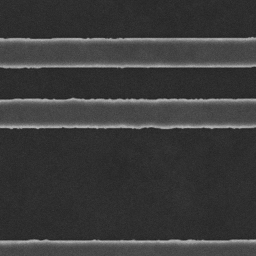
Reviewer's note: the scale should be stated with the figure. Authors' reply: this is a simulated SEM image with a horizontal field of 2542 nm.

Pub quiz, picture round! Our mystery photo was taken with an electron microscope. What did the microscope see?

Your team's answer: lines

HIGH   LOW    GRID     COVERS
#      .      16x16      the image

................
................
################
################
................
................
################
################
................
................
................
................
................
................
................
################